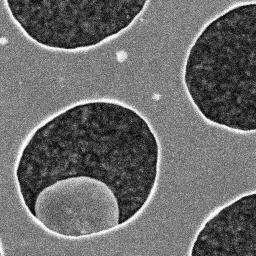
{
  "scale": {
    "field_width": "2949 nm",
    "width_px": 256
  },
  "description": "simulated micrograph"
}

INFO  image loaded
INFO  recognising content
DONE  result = holes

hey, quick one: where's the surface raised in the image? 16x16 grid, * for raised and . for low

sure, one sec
*........******.
*.......*****...
**....******....
************....
************....
************....
*****..*****....
***......****...
**........******
*.........******
*.........******
*.........******
*........******.
**......*****...
***...*******...
************....